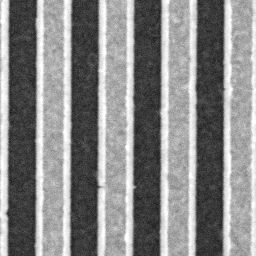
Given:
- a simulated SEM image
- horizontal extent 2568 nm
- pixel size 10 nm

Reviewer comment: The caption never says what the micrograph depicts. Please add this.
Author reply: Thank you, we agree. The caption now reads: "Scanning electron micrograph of one or a few lines or trenches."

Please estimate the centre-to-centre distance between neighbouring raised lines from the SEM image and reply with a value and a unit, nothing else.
627 nm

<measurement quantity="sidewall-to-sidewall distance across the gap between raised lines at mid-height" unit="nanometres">340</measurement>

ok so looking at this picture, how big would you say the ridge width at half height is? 0.289 um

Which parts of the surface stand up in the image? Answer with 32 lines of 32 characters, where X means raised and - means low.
X----XXXX----XXX-----XXX----XXXX
X----XXX-----XXX-----XXX----XXXX
X----XXX-----XXX-----XXX----XXXX
X----XXX-----XXX-----XXX----XXXX
X----XXX-----XXX-----XXX----XXXX
X----XXX-----XXX-----XXX----XXXX
X----XXX-----XXX-----XXX----XXXX
X----XXX-----XXX-----XXX----XXXX
X----XXX-----XXX-----XXX----XXXX
X----XXX-----XXX-----XXX----XXXX
X----XXX-----XXX-----XXX----XXXX
X----XXX-----XXX-----XXX----XXXX
X----XXX-----XXX-----XXX----XXXX
X----XXX-----XXX-----XXX----XXXX
X----XXX-----XXX-----XXX----XXXX
X----XXX-----XXX-----XXX----XXXX
X----XXX-----XXX-----XXX----XXXX
X----XXX-----XXX-----XXX----XXXX
X----XXX-----XXX-----XXX----XXXX
X----XXX-----XXX-----XXX----XXXX
X----XXX-----XXX-----XXX----XXXX
X----XXX-----XXX-----XXX----XXXX
X----XXX-----XXX----XXXX----XXXX
X----XXX-----XXX----XXXX----XXXX
X----XXX-----XXX----XXXX----XXXX
X----XXX-----XXX----XXXX----XXXX
-----XXX-----XXX----XXXX----XXXX
X----XXX-----XXX----XXXX----XXXX
X----XXX-----XXX----XXXX----XXXX
X----XXX-----XXX----XXXX----XXXX
X----XXX-----XXX----XXXX----XXXX
X----XXX-----XXX----XXXX----XXXX